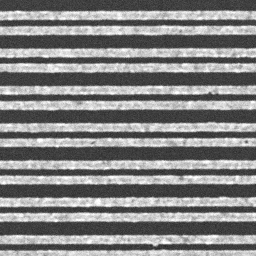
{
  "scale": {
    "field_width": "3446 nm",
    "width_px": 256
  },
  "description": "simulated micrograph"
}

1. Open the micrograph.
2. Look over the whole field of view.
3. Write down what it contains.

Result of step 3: parallel lines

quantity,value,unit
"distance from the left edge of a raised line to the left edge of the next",252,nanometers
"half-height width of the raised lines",0.106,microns